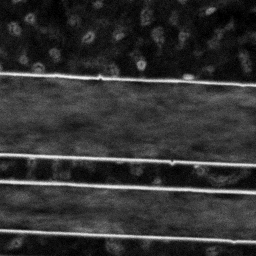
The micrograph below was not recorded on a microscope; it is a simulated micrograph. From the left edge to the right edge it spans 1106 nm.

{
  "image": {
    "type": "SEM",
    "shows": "one or a few lines or trenches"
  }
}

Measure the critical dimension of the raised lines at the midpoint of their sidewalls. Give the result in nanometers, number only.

122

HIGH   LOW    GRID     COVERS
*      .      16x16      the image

****************
****************
****************
****************
****************
................
................
................
................
................
****************
...*************
................
................
**..............
****************